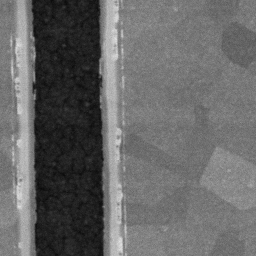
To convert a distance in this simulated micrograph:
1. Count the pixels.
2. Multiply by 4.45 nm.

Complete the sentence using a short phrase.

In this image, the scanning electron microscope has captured one or a few lines or trenches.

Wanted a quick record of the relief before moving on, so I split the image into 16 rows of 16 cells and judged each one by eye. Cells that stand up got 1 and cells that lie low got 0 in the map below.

1000000111111111
1000000111111111
1000000111111111
1000000111111111
1100000111111111
1100000111111111
1000000111111111
1100000111111111
1100000111111111
1100000111111111
1000000111111111
1100000111111111
1100000111111111
1100000111111111
1100000111111111
1100000111111111